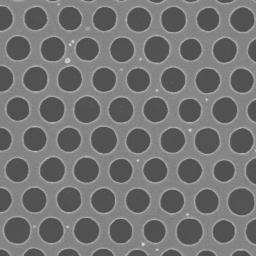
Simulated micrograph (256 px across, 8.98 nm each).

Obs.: a regular array of holes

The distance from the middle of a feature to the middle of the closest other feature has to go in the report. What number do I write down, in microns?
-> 0.308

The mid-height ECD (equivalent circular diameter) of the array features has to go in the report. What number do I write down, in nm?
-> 218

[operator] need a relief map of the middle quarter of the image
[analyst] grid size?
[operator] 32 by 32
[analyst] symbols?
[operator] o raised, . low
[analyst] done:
o.oooooooooooooooooooooooooooooo
...ooooo....ooooo...oooooo...ooo
....ooo......ooo.....oooo.....oo
.....oo......ooo.....ooo......oo
....ooo......ooo.....ooo......oo
....ooo......ooo.....oooo.....oo
...ooooo....ooooo...oooooo...ooo
oooooooooooooooooooooooooooooooo
oooo...oooooo..ooooooo..oooooooo
ooo.....oooo.....ooo.....oooo...
ooo......oo......ooo......ooo...
oo.......oo......ooo......ooo...
ooo......oo......ooo......ooo...
ooo.....oooo.....oooo....oooo...
ooooo..oooooo...oooooo.oooooooo.
oooooooooooooooooooooooooooooooo
...ooooo....ooooo...oooooo...ooo
....ooo......ooo.....ooo......oo
....ooo......ooo......oo......oo
....ooo......oo.......oo......oo
....ooo......ooo.....ooo......oo
...ooooo....oooo.....oooo....ooo
oooooooooooooooooooooooooooooooo
oooo..oooooooooooooooooooooooooo
ooo.....oooo....ooooo....oooo...
ooo......ooo.....ooo......ooo...
oo.......oo......ooo......oo....
ooo......oo......ooo......oo....
ooo.....oooo.....ooo.....oooo...
ooooo..oooooo..ooooooo.ooooooo..
oooooooooooooooooooooooooooooooo
...ooooo....ooooo...oooooo..oooo